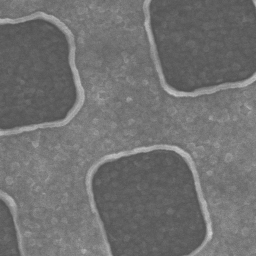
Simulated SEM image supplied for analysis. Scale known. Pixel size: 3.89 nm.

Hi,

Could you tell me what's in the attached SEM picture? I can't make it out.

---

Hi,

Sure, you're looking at holes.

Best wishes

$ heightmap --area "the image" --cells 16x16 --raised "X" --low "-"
XXXXXXXXX-------
---XXXXXX-------
----XXXXXX------
----XXXXXX------
----XXXXXX------
-----XXXXXX--XXX
-----XXXXXXXXXXX
----XXXXXXXXXXXX
XXXXXXXXXXXXXXXX
XXXXXXXXX--XXXXX
XXXXXX------XXXX
XXXXXX------XXXX
XXXXXX------XXXX
-XXXXX-------XXX
-XXXXX-------XXX
-XXXXXX-----XXXX